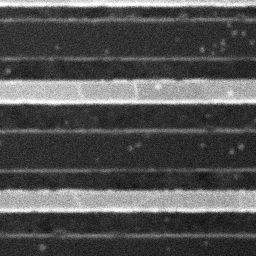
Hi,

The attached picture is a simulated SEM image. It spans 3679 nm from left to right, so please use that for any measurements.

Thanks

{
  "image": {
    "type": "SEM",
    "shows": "lines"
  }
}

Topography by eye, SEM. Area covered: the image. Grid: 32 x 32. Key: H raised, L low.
HHHHHHHHHHHHHHHHHHHHHHHHHHHHHHHH
LLLLLLLLLLLLLLLLLLLLLLLLLLLLLLLL
LLLLLLLLLLLLLLLLLLLLLLHHLLLLLHHL
HHHHHHHHHHHHHHHHHHHHHHHHHHHHHHHH
HHHHHHHHHHHHHHHHHHHHHHHHHHHHHHHH
HHHHHHHHHHHHHHHHHHHHHHHHHHHHHHHH
HHHHHHHHHHHHHHHHHHHHHHHHHHHHHHHH
LLLLLLLLLLLLLLLLLLLLLLLLLLLLLLLL
LLLLLLLLLLLLLLLLLLLLLLLLLLLLLLLL
LLLLLLLLLLLLLLLLLLLLLLLLLLLLLLLL
HHHHHHHHHHHHHHHHHHHHHHHHHHHHHHHH
HHHHHHHHHHHHHHHHHHHHHHHHHHHHHHHH
HHHHHHHHHHHHHHHHHHHHHHHHHHHHHHHH
LLLLLLLLLLLLLLLLLLLLLLLLLLLLLLLL
LLLLLLLLLLLLLLLLLLLLLLLLLLLLLLLL
LLLLLLLLLLLLLLLLLLLLLLLLLLLLLLLL
HHHHHHHHHHHHHHHHHHHHHHHHHHHHHHHH
HHHHHHHHHHHHHHHHHHHHHHHHHHHHHHHH
HHHHHHHHHHHHHHHHHHHHHHHHHHHHHHHH
HHHHHHHHHHHHHHHHHHHHHHHHHHHHHHHH
HHHHHHHHHHHHHHHHHHHHHHHHHHHHHHHH
LLLLLLLLLLLLLLLLLLLLLLLLLLLLLLLL
LLLLLLLLLLLLLLLLLLLLLLLLLLLLLLLL
LLLLLLLLLLLLLLLLLLLLLLLLLLLLLLLL
HHHHHHHHHHHHHHHHHHHHHHHHHHHHHHHH
HHHHHHHHHHHHHHHHHHHHHHHHHHHHHHHH
LLLLLLLLLLLLLLLLLLLLLLLLLLLLLLLL
LLLLLLLLLLLLLLLLLLLLLLLLLLLLLLLL
LLLLLLLLLLLLLLLLLLLLLLLLLLLLLLLL
LLLLLLHHHLLLLLLLLLLLLLLLLLLLLLLL
HHHHHHHHHHHHHHHHHHHHHHHHHHHHHHHH
HHHHHHHHHHHHHHHHHHHHHHHHHHHHHHHH